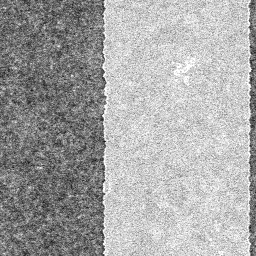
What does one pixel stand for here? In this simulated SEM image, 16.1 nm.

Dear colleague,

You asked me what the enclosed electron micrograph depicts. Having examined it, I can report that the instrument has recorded one or a few lines or trenches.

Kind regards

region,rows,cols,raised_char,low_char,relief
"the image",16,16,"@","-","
-------@@@@@@@@@
-------@@@@@@@@@
-------@@@@@@@@@
-------@@@@@@@@@
-------@@@@@@@@@
-------@@@@@@@@@
-------@@@@@@@@@
------@@@@@@@@@@
-------@@@@@@@@@
-------@@@@@@@@@
-------@@@@@@@@@
-------@@@@@@@@@
-------@@@@@@@@@
-------@@@@@@@@@
------@@@@@@@@@@
-------@@@@@@@@@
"